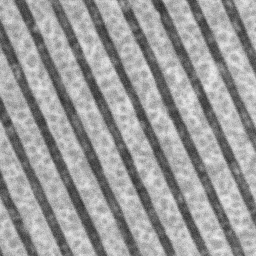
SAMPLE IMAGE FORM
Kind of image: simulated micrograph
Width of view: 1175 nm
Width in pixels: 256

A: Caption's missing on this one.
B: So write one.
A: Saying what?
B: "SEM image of parallel lines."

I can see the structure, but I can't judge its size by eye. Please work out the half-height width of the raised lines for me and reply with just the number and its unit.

91.9 nm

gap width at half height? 50.6 nm